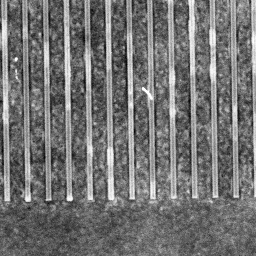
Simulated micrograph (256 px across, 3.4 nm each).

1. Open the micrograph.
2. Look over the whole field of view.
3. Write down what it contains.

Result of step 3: parallel lines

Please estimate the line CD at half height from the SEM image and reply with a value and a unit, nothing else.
16.1 nanometres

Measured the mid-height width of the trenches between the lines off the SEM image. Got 0.0544 um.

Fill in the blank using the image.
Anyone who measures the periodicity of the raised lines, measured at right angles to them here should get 70.8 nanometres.